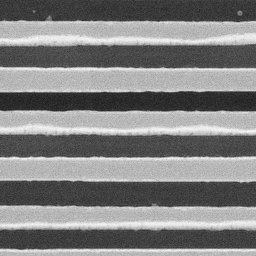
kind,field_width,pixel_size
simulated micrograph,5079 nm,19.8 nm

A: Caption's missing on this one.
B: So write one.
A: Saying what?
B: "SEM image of lines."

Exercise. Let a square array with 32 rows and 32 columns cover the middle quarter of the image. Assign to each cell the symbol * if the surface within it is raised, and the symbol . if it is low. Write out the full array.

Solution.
................................
********************************
********************************
********************************
********************************
********************************
********************************
................................
................................
................................
................................
................................
********************************
********************************
********************************
********************************
********************************
................................
................................
................................
................................
................................
................................
*......*.*................***.*.
********************************
********************************
********************************
********************************
********************************
................................
................................
................................